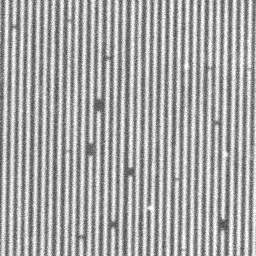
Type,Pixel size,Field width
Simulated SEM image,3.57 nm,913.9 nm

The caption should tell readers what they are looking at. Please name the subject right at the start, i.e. parallel lines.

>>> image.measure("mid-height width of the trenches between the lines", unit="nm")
18.3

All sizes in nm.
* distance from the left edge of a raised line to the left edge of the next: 28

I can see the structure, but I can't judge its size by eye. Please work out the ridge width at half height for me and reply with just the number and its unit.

0.008 um